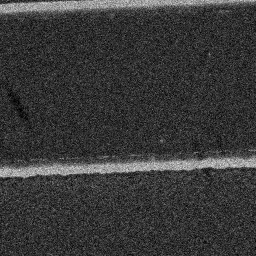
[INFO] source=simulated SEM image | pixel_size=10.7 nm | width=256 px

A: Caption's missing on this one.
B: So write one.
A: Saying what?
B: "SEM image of one or a few lines or trenches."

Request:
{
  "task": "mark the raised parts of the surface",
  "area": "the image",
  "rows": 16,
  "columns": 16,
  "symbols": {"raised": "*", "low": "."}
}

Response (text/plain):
****************
****************
****************
****************
****************
****************
****************
****************
****************
****************
*******.........
................
................
................
................
................